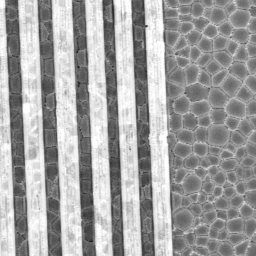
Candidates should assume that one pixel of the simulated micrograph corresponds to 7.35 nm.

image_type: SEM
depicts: parallel lines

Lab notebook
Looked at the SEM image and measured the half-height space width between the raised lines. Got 123 nanometers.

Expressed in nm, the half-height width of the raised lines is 103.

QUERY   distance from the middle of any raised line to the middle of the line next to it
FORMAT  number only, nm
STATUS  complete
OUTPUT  230